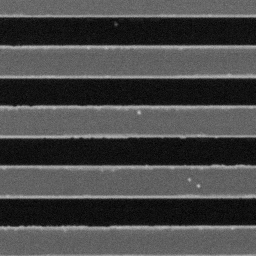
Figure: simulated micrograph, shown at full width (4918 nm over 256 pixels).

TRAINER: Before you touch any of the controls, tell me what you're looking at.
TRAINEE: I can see lines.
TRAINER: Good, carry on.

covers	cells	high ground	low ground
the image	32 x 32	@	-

@@@@@@@@@@@@@@@@@@@@@@@@@@@@@@@@
@@@@@@@@@@@@@@@@@@@@@@@@@@@@@@@@
--------------------------------
--------------------------------
--------------------------------
--------------------------------
@@@@@@@@@@@@@@@@@@@@@@@@@@@@@@@@
@@@@@@@@@@@@@@@@@@@@@@@@@@@@@@@@
@@@@@@@@@@@@@@@@@@@@@@@@@@@@@@@@
@@@@@@@@@@@@@@@@@@@@@@@@@@@@@@@@
--------------------------------
--------------------------------
--------------------------------
@@@@@@@@@@@@@@@@@@@@@@@@@@@@@@@@
@@@@@@@@@@@@@@@@@@@@@@@@@@@@@@@@
@@@@@@@@@@@@@@@@@@@@@@@@@@@@@@@@
@@@@@@@@@@@@@@@@@@@@@@@@@@@@@@@@
--------------------------------
--------------------------------
--------------------------------
--------------------------------
@@@@@@@@@@@@@@@@@@@@@@@@@@@@@@@@
@@@@@@@@@@@@@@@@@@@@@@@@@@@@@@@@
@@@@@@@@@@@@@@@@@@@@@@@@@@@@@@@@
@@@@@@@@@@@@@@@@@@@@@@@@@@@@@@@@
--------------------------------
--------------------------------
--------------------------------
@@@@@@@@@@@@@@@@@@@@@@@@@@@@@@@@
@@@@@@@@@@@@@@@@@@@@@@@@@@@@@@@@
@@@@@@@@@@@@@@@@@@@@@@@@@@@@@@@@
@@@@@@@@@@@@@@@@@@@@@@@@@@@@@@@@